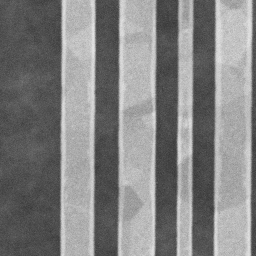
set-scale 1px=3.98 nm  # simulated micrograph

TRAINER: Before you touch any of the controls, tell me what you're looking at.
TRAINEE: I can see wiring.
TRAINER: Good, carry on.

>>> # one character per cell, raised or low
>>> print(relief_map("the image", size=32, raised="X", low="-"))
--------XXXX---XXXX----X---XXXX-
--------XXXX---XXXX----X---XXXX-
--------XXXX---XXXX----X---XXXX-
--------XXXX---XXXX----X---XXXX-
--------XXXX---XXXX----X---XXXX-
--------XXXX---XXXX----X---XXXX-
--------XXXX---XXXX--------XXXX-
--------XXXX---XXXX--------XXXX-
--------XXXX---XXXX--------XXXX-
--------XXXX---XXXX--------XXXX-
--------XXXX---XXXX--------XXXX-
--------XXXX---XXXX----X---XXXX-
--------XXXX---XXXX----X---XXXX-
--------XXXX---XXXX----X---XXXX-
--------XXXX---XXXX---XX---XXXX-
--------XXXX---XXXX---XX---XXXX-
--------XXX----XXXX---XX---XXXX-
--------XXX----XXXX---XX---XXXX-
--------XXX----XXXX---XX---XXXX-
--------XXX----XXXX---XX---XXXX-
--------XXX----XXXX---XX---XXXX-
--------XXXX---XXXX---XX---XXXX-
--------XXXX---XXXX---XX---XXXX-
--------XXXX---XXXX---XX---XXXX-
--------XXXX---XXXX---XX---XXXX-
--------XXX----XXXX---XX---XXXX-
--------XXX----XXXX---XX---XXXX-
--------XXX----XXXX---XX---XXXX-
--------XXX----XXXX---XX---XXXX-
--------XXX----XXXX---XX---XXXX-
--------XXX----XXXX---XX---XXXX-
--------XXX----XXXX---XX---XXXX-